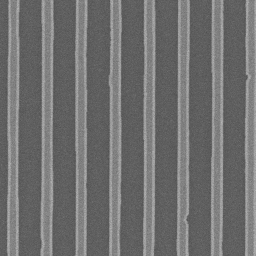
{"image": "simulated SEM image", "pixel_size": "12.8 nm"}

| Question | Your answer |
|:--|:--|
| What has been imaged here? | parallel lines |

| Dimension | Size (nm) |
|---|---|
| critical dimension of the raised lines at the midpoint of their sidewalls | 108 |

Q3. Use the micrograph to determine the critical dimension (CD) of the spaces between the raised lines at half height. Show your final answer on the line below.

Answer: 334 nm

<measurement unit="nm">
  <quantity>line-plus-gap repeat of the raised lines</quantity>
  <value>436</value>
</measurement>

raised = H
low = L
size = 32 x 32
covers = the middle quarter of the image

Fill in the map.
LLLHHLLLLLLLHHLLLLLLHHLLLLLLLHHL
LLLHHLLLLLLLHHLLLLLLHHLLLLLLLHHL
LLLHHLLLLLLLHHLLLLLLHHLLLLLLLHHL
LLLHHLLLLLLLHHLLLLLLHHLLLLLLLHHL
LLLHHLLLLLLLHHLLLLLLHHLLLLLLLHHL
LLLHHLLLLLLLHHLLLLLLHHLLLLLLLHHL
LLLHHLLLLLLLHHLLLLLLHHLLLLLLLHHL
LLLHHLLLLLLLHHLLLLLLHHLLLLLLLHHL
LLLHHLLLLLLLHHLLLLLLHHLLLLLLLHHL
LLLHHLLLLLLLHHLLLLLLHHLLLLLLLHHL
LLLHHLLLLLLLHHLLLLLLHHLLLLLLLHHL
LLLHHLLLLLLLHHLLLLLLHHLLLLLLLHHL
LLLHHLLLLLLLHHLLLLLLHHLLLLLLLHHL
LLLHHLLLLLLLHHLLLLLLHHLLLLLLLHHL
LLLHHLLLLLLLHHLLLLLLHHLLLLLLLHHL
LLLHHLLLLLLLHHLLLLLLHHLLLLLLLHHL
LLLHHLLLLLLLHHLLLLLLHHLLLLLLLHHL
LLLHHLLLLLLLHHLLLLLLHHLLLLLLLHHL
LLLHHLLLLLLLHHLLLLLLHHLLLLLLLHHL
LLLHHLLLLLLLHHLLLLLLHHLLLLLLLHHL
LLLHHLLLLLLLHHLLLLLLHHLLLLLLLHHL
LLLHHLLLLLLLHHLLLLLLHHLLLLLLLHHL
LLLHHLLLLLLLHHLLLLLLHHLLLLLLLHHL
LLLHHLLLLLLLHHLLLLLLHHLLLLLLLHHL
LLLHHLLLLLLLHHLLLLLLHHLLLLLLLHHL
LLLHHLLLLLLLHHLLLLLLHHLLLLLLLHHL
LLLHHLLLLLLLHHLLLLLLHHLLLLLLLHHL
LLLHHLLLLLLLHHLLLLLLHHLLLLLLLHHL
LLLHHLLLLLLLHHLLLLLLHHLLLLLLLHHL
LLLHHLLLLLLLHHLLLLLLHHLLLLLLLHHL
LLLHHLLLLLLLHHLLLLLLHHLLLLLLLHHL
LLLHHLLLLLLLHHLLLLLLHHLLLLLLLHHL